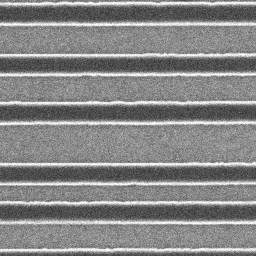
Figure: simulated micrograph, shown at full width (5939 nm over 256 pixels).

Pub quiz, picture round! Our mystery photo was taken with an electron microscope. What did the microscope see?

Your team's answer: lines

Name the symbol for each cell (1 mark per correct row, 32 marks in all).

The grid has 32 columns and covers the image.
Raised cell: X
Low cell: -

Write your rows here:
XXXXXXXXXXXXXXXXXXXXXXXXXXXXXXXX
XXXXXXXXXXXXXXXXXXXXXXXXXXXXXXXX
XXXXXXXXXXXXXXXXXXXXXXXXXXXXXXXX
--------------------------------
--------------------------------
--------------------------------
--------------------------------
XXXXXXXXXXXXXXXXXXXXXXXXXXXXXXXX
XXXXXXXXXXXXXXXXXXXXXXXXXXXXXXXX
--------------------------------
--------------------------------
--------------------------------
--------------------------------
XXXXXXXXXXXXXXXXXXXXXXXXXXXXXXXX
XXXXXXXXXXXXXXXXXXXXXXXXXXXXXXXX
XX----------------XX------------
--------------------------------
--------------------------------
--------------------------------
--------------------------------
-----------------------XX--X-XXX
XXXXXXXXXXXXXXXXXXXXXXXXXXXXXXXX
XXXXXXXXXXXXXXXXXXXXXXXXXXXXXXXX
--------------------------------
--------------------------------
XXXXXXXXXXXXXXXXXXXXXXXXXXXXXXXX
XXXXXXXXXXXXXXXXXXXXXXXXXXXXXXXX
XXXXXXXXXXXXXXXXXXXXXXXXXXXXXXXX
--------------------------------
--------------------------------
--------------------------------
XXXXXXXXXXXXXXXXXXXXXXXXXXXXXXXX